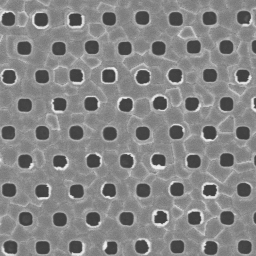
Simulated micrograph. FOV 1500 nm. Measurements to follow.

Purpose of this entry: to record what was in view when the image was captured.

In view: a regular array of holes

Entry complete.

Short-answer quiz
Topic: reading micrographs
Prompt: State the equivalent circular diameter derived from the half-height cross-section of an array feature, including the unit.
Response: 84.5 nm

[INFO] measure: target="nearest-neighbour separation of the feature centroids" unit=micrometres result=0.189